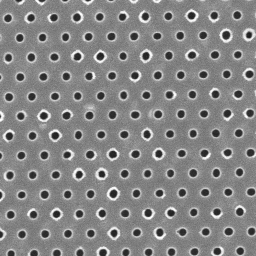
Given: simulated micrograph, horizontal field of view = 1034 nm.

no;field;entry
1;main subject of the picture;a regular array of holes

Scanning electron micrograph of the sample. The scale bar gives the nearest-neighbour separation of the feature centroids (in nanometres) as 90.8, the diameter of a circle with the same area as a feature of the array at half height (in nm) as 32.5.